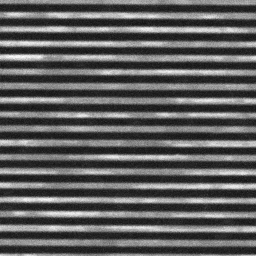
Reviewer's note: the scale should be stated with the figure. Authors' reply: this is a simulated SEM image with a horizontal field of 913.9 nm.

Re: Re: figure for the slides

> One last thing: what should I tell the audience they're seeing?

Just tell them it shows parallel lines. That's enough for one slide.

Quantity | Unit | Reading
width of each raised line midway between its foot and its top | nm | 18.8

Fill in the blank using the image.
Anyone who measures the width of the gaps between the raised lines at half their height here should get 0.0313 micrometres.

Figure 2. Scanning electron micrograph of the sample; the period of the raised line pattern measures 50.8 nm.